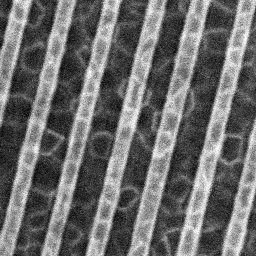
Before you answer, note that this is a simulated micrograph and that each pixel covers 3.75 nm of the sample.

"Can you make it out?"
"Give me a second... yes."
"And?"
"parallel lines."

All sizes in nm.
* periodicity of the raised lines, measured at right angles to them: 164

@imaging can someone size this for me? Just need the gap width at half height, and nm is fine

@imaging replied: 114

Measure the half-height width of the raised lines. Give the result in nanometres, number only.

51.9